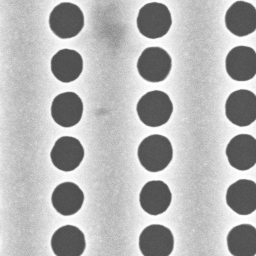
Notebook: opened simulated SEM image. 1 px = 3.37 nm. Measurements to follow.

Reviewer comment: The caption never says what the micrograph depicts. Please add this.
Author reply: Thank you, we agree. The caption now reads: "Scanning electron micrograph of a regular array of holes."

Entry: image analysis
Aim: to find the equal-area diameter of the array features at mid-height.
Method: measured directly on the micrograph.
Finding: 0.117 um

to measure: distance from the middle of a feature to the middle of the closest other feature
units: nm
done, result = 149